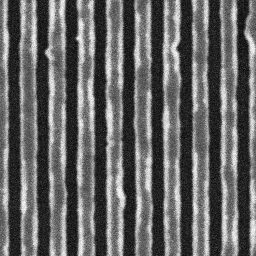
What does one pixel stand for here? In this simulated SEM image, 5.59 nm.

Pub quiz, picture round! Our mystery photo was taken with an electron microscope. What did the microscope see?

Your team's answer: parallel lines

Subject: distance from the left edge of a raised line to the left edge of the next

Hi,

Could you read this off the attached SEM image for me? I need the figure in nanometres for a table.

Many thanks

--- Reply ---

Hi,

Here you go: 160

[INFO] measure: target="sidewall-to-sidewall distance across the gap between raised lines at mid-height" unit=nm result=77.5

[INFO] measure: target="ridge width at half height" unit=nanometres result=82.4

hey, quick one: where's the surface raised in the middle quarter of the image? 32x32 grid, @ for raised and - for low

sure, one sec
----@@@----@@@----@@@----@@@@---
----@@@----@@@@---@@@----@@@@---
----@@@----@@@@---@@@----@@@@---
----@@@----@@@@---@@@@---@@@@---
----@@@----@@@@---@@@@---@@@@---
----@@@----@@@@---@@@@---@@@@---
----@@@----@@@----@@@@---@@@@---
----@@@----@@@----@@@@---@@@@---
----@@@----@@@----@@@@---@@@@---
----@@@----@@@----@@@@---@@@----
----@@@----@@@----@@@@---@@@@---
----@@@----@@@----@@@@---@@@----
----@@@----@@@----@@@@---@@@----
----@@@----@@@----@@@@---@@@----
----@@@----@@@----@@@@---@@@@---
----@@@----@@@----@@@@---@@@@---
----@@@----@@@----@@@@---@@@@---
----@@@----@@@----@@@@---@@@@---
----@@@----@@@----@@@@---@@@@---
----@@@----@@@----@@@----@@@@---
----@@@----@@@----@@@@---@@@@---
----@@@----@@@----@@@@---@@@@---
----@@@----@@@----@@@@---@@@@---
----@@@----@@@----@@@@---@@@@---
----@@@----@@@----@@@@---@@@@---
----@@@----@@@----@@@@---@@@@---
----@@@----@@@----@@@@---@@@@---
----@@@----@@@----@@@-----@@@---
----@@@----@@@----@@@@---@@@@---
----@@@----@@@----@@@----@@@@---
----@@@----@@@----@@@----@@@@---
----@@@----@@@@---@@@----@@@@---